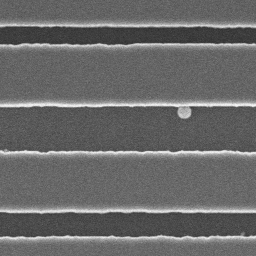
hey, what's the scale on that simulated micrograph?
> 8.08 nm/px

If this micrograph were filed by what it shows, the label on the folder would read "lines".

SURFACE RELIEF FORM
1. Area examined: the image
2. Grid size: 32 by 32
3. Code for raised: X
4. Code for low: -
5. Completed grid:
XXXXXXXXXXXXXXXXXXXXXXXXXXXXXXXX
XXXXXXXXXXXXXXXXXXXXXXXXXXXXXXXX
XXXXXXXXXXXXXXXXXXXXXXXXXXXXXXXX
--------------------------------
--------------------------------
---XXX------X---XXXXXXXXXXXXXXXX
XXXXXXXXXXXXXXXXXXXXXXXXXXXXXXXX
XXXXXXXXXXXXXXXXXXXXXXXXXXXXXXXX
XXXXXXXXXXXXXXXXXXXXXXXXXXXXXXXX
XXXXXXXXXXXXXXXXXXXXXXXXXXXXXXXX
XXXXXXXXXXXXXXXXXXXXXXXXXXXXXXXX
XXXXXXXXXXXXXXXXXXXXXXXXXXXXXXXX
XXXXXXXXXXXXXXXXXXXXXXXXXXXXXXXX
--------------------------------
--------------------------------
--------------------------------
--------------------------------
--------------------------------
--------------------------------
XXXXXXXXXXXXXXXXXXXXXXXXXXXXXXXX
XXXXXXXXXXXXXXXXXXXXXXXXXXXXXXXX
XXXXXXXXXXXXXXXXXXXXXXXXXXXXXXXX
XXXXXXXXXXXXXXXXXXXXXXXXXXXXXXXX
XXXXXXXXXXXXXXXXXXXXXXXXXXXXXXXX
XXXXXXXXXXXXXXXXXXXXXXXXXXXXXXXX
XXXXXXXXXXXXXXXXXXXXXXXXXXXXXXXX
-XXXXX-----XXX----XXX--X------XX
--------------------------------
--------------------------------
--------------------------------
XXXXXXXXXXXXXXXXXXXXXXXXXXXXXXXX
XXXXXXXXXXXXXXXXXXXXXXXXXXXXXXXX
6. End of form